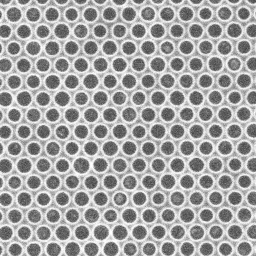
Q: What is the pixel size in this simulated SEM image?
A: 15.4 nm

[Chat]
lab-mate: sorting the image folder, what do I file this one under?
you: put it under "a regular array of holes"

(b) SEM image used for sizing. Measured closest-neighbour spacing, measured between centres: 289 nm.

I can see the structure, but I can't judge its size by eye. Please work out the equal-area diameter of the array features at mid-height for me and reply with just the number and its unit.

220 nanometres